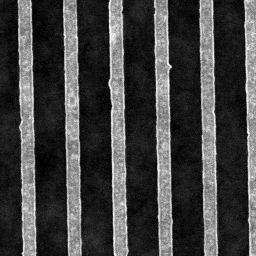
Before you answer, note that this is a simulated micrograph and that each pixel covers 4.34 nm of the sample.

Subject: parallel lines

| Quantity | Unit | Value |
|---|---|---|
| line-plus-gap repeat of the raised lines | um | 0.197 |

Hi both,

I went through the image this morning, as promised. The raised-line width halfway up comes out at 0.057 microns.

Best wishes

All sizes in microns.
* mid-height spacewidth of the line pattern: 0.141